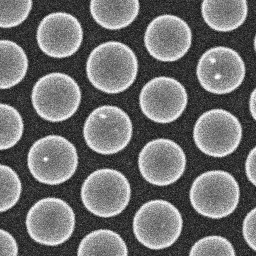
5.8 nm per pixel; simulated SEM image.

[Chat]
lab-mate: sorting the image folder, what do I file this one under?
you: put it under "a regular array of raised bodies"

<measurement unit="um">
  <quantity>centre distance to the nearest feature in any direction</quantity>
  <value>0.355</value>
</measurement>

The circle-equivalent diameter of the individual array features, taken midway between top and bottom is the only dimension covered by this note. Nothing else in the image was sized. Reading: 0.274 microns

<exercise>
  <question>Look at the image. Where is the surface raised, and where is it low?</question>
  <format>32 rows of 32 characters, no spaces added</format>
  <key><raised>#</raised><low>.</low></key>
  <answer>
####.......######........######.
####.......######........######.
###..####...#####..####...####..
.....#####....#....#####...##...
.....#####........######........
##...#####...##...######........
###...###...#####..####...###...
###........######...##...#####..
###........######........######.
###...##...######........#####..
##...####...####..####...#####..
....######...##...#####....#....
....######........#####........#
##..######...##...#####........#
##...####..#####..####...####...
###........#####.........#####..
###........#####........######..
##...###...#####....#...######..
#...#####...###...####...####...
....######.......######....#...#
....######.......######........#
##..#####...###...#####...##...#
##...###...#####..####...####..#
###.......######........######..
##........######........######..
##...###...#####..###...######..
....#####...###..#####...####..#
...######........######........#
...######........######.......##
#...#####..####..#####.........#
##....#...######..###....####..#
##........######........#####...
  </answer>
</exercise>